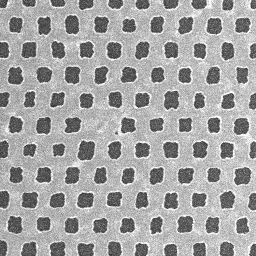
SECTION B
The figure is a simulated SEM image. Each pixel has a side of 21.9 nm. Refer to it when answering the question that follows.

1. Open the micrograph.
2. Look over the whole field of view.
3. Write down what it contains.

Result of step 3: a regular array of holes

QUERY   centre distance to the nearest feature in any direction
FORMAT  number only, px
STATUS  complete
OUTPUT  27.8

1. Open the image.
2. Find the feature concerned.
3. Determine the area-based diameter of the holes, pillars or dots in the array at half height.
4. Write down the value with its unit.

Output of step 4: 360 nanometers